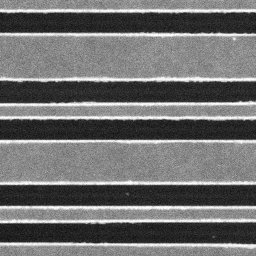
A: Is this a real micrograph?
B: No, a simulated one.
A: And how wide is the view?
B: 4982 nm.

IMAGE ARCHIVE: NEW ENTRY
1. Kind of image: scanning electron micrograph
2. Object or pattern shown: lines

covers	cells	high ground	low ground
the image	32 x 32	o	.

oooooooooooooooooooooooooooooooo
oooooooo.oooooooooo.oooo.o.oooo.
................................
................................
oooooooooooooooooooooooooooooooo
oooooooooooooooooooooooooooooooo
oooooooooooooooooooooooooooooooo
oooooooooooooooooooooooooooooooo
oooooooooooooooooooooooooooooooo
oooooooooooooooooooooooooooooooo
................................
................................
................................
oooooooooooooooooooooooooooooooo
oooooooooooooooooooooooooooooooo
................................
................................
................................
oooooooooooooooooooooooooooooooo
oooooooooooooooooooooooooooooooo
oooooooooooooooooooooooooooooooo
oooooooooooooooooooooooooooooooo
oooooooooooooooooooooooooooooooo
................................
................................
................................
oooooooooooooooooooooooooooooooo
oooooooooooooooooooooooooooooooo
................................
................................
ooooooooooo.....................
oooooooooooooooooooooooooooooooo